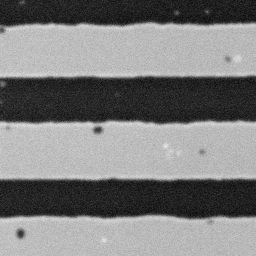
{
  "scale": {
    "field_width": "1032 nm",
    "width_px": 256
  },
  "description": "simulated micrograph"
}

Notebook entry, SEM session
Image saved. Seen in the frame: lines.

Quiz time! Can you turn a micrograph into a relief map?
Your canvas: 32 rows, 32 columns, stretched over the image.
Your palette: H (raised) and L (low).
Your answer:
LLLLLLLLLLLLLLLLLLLLLLLLLLLLLLLL
LLLLLLLLLLLLLLLLLLLLLLLLLLLLLLLL
LLLLLLLLLLLLLLLLLLLLLLLLLLLLLLLL
HHHHHHHHHHHHHHHHHHHHHHHHHHHHHHHH
HHHHHHHHHHHHHHHHHHHHHHHHHHHHHHHH
HHHHHHHHHHHHHHHHHHHHHHHHHHHHHHHH
HHHHHHHHHHHHHHHHHHHHHHHHHHHHHHHH
HHHHHHHHHHHHHHHHHHHHHHHHHHHHHHHH
HHHHHHHHHHHHHHHHHHHHHHHHHHHHHHHH
HHHHHHHHHLLLHHHHHLLLLLLLLLLLLLLL
LLLLLLLLLLLLLLLLLLLLLLLLLLLLLLLL
LLLLLLLLLLLLLLLLLLLLLLLLLLLLLLLL
LLLLLLLLLLLLLLLLLLLLLLLLLLLLLLLL
LLLLLLLLLLLLLLLLLLLLLLLLLLLLLLLL
LLLLLLLLLLLLLLLLLLLLLLLLLLLLLLLL
HHHHLHHHHHHHHHHHHHHLLLHLHHHHHHHH
HHHHHHHHHHHHHHHHHHHHHHHHHHHHHHHH
HHHHHHHHHHHHHHHHHHHHHHHHHHHHHHHH
HHHHHHHHHHHHHHHHHHHHHHHHHHHHHHHH
HHHHHHHHHHHHHHHHHHHHHHHHHHHHHHHH
HHHHHHHHHHHHHHHHHHHHHHHHHHHHHHHH
HHHHHHHHHHHHHHHHHHHHHHHHHHHHHHHH
LLLLLLLLLLLLLLLLLLLLLLLLLLLLLLLL
LLLLLLLLLLLLLLLLLLLLLLLLLLLLLLLL
LLLLLLLLLLLLLLLLLLLLLLLLLLLLLLLL
LLLLLLLLLLLLLLLLLLLLLLLLLLLLLLLL
LLLLLLLLLLLLLLLLLLLLLLLLLLLLLLLL
HHHHHHHHHHHHHHHHHHHHHHHHHHHHHHHH
HHHHHHHHHHHHHHHHHHHHHHHHHHHHHHHH
HHHHHHHHHHHHHHHHHHHHHHHHHHHHHHHH
HHHHHHHHHHHHHHHHHHHHHHHHHHHHHHHH
HHHHHHHHHHHHHHHHHHHHHHHHHHHHHHHH